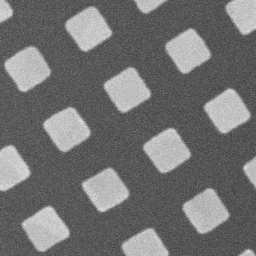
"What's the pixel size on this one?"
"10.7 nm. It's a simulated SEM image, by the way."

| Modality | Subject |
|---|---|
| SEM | a regular array of raised bodies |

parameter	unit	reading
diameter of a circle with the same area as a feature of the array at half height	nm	415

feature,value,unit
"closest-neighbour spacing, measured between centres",71.9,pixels